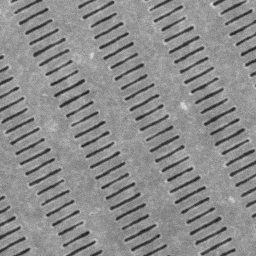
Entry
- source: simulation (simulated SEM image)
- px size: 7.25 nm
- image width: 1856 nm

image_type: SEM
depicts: a regular array of holes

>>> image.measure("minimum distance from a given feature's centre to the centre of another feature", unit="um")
0.0825